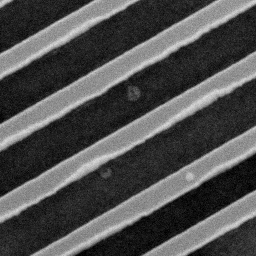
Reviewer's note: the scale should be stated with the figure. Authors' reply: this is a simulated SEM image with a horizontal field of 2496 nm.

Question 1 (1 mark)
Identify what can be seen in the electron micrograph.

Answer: lines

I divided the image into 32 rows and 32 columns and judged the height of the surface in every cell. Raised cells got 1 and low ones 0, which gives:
10000000000111110000000000111111
00000000011111100000000001111100
00000000111110000000000111110000
00000011111000000000011111100000
00001111100000000001111110000000
00111111000000000011111000000000
11111100000000001111100000000000
11110000000000111111000000000011
11000000000011111100000000001111
10000000000111110000000000011111
00000000011111000000000001111100
00000001111110000000000111110000
00000111111000000000011111000000
00001111100000000000111110000000
00111111000000000011111000000000
11111100000000001111100000000000
11110000000000111111000000000001
11000000000001111100000000000111
00000000000111110000000000011111
00000000011111000000000001111110
00000001111100000000000011111000
00000011111000000000001111100000
00001111100000000000111111000000
00111111000000000001111100000000
11111100000000000111110000000001
11110000000000011111100000000111
11000000000001111110000000011111
00000000000011111000000001111110
00000000001111100000000011111000
00000000111110000000001111100000
00000011111100000000111111000000
00000111110000000001111100000000